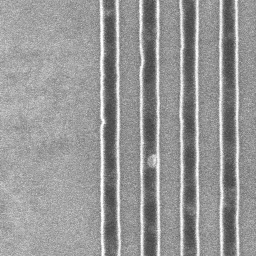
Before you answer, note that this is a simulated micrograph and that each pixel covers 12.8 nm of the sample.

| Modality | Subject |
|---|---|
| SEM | parallel lines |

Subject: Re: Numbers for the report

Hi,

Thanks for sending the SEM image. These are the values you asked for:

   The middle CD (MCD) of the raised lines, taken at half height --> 217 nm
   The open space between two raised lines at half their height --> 295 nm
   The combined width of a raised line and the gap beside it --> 509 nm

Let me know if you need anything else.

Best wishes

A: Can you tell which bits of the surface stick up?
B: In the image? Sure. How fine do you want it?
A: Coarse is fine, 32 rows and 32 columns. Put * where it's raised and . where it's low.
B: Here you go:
.............**...**...**...**..
.............**...**...**...**..
.............**...**...**...**..
.............**...**...**...**..
.............**...**...**...**..
.............**...**...**...**..
.............**...**...**...**..
.............**...**...**...**..
.............**...**...**...**..
.............**...**...**...**..
.............**...**...**...**..
.............**...**...**...**..
.............**...**...**...**..
.............**...**...**...**..
.............**...**...**...**..
.............**...**...**...**..
.............**...**...**...**..
.............**...**...**...**..
.............**...**...**...**..
.............**...**...**...**..
.............**...**...**...**..
.............**...**...**...**..
.............**...**...**...**..
.............**...**...**...**..
.............**...**...**...**..
.............**...**...**...**..
.............**...**...**...**..
.............**...**...**...**..
.............**...**...**...**..
.............**...**...**...**..
.............**...**...**...**..
.............**...**...**...**..